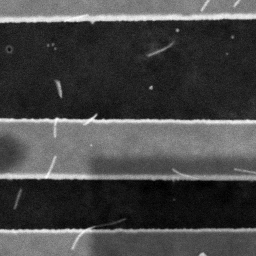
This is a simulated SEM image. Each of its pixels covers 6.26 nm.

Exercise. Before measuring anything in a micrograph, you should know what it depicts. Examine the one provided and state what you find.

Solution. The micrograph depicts lines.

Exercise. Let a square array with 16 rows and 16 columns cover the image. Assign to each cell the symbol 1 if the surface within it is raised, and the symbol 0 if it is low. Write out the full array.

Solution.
1111111111111111
0000000000000000
0000000000000000
0000000000000000
0000000000000000
0000000000000000
0000000000000000
1111111111101001
1111111111111111
1111111111111111
1111111111111111
0000000000000000
0000000000000000
0000000000000000
1111111111111111
1111111111111111